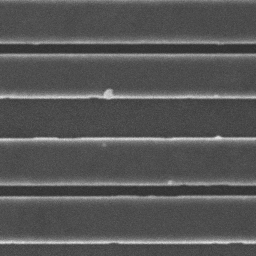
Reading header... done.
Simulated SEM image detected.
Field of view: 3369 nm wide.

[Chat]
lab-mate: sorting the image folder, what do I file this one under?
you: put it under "lines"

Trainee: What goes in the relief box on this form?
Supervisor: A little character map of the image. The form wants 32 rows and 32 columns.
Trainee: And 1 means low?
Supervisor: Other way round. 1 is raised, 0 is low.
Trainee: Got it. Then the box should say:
11111111111111111111111111111111
11111111111111111111111111111111
11111111111111111111111111111111
11111111111111111111111111111111
11111111111111111111111111111111
00001000000000000000000000000000
00000000000000000000000000000000
11111111111111111111111111111111
11111111111111111111111111111111
11111111111111111111111111111111
11111111111111111111111111111111
11111111111111111111111111111111
00000000000000000000000000000000
00000000000000000000000000000000
00000000000000000000000000000000
00000000000000000000000000000000
00000000000000000000000000000000
11111111111111111111111111111111
11111111111111111111111111111111
11111111111111111111111111111111
11111111111111111111111111111111
11111111111111111111111111111111
11111111111111111111111111111111
00000000000000000000000000000000
00000000000000000000000000000000
11111111111111111111111111111111
11111111111111111111111111111111
11111111111111111111111111111111
11111111111111111111111111111111
11111111111111111111111111111111
00000000000000000000000000000000
00000000000000000000000000000000